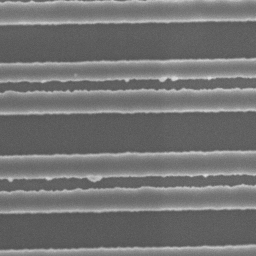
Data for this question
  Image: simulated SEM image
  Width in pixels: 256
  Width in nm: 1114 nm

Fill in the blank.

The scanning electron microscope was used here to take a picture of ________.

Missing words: lines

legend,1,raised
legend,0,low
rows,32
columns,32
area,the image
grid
11111111111111111111111111111111
11111111111111111111111111111111
11111111111111111111111111010000
00000000000000000000000000000000
00000000000000000000000000000000
00000000000000000000000000000000
00000000000000000000000000000000
00000000000000000000000000000011
11111111111111111111111111111111
11111111111111111111111111111111
11111111111111111111111111111111
11111111111111111111111111111111
11111111111111111111111111111111
11111111111111111111111111111111
00000000000000000000000000000000
00000000000000000000000000000000
00000000000000000000000000000000
00000000000000000000000000000000
00000000000000000000000000000000
00001111111111111111111111111111
11111111111111111111111111111111
11111111111111111111111111111111
11111111111111111111111111111111
11111111111111111111111111111111
11111111111111111111111111111111
11111111111111111111111111111111
11111000000000000000000000000000
00000000000000000000000000000000
00000000000000000000000000000000
00000000000000000000000000000000
00000000000000000000000000000000
11111111111111111111111111111111